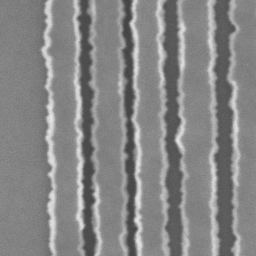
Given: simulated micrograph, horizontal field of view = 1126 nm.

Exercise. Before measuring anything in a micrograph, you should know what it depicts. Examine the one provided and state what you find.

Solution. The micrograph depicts parallel lines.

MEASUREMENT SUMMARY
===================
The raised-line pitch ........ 0.194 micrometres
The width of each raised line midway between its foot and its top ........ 135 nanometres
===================